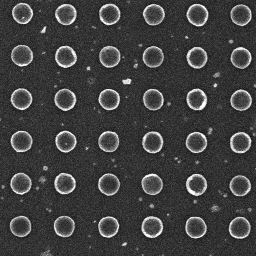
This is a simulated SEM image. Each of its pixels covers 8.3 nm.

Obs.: a regular array of raised bodies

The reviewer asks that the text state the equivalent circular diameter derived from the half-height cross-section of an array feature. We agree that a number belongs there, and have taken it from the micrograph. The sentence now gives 173 nanometers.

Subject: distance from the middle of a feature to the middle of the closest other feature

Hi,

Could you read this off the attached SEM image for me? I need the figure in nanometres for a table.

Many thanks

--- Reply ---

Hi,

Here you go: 351